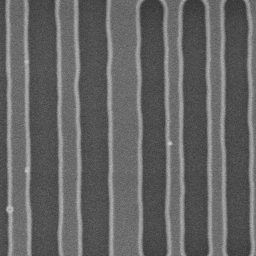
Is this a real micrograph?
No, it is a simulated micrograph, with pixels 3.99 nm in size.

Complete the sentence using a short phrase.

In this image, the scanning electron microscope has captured groups of lines, slits or small figures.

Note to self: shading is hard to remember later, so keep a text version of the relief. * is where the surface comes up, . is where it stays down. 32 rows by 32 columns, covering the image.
.**....***...****...***...**...*
.**....***...****....**...**...*
.**....***...****....**...**...*
.**....***...****....**...**...*
.**....***....***....**...**...*
.**....***....***....**...**...*
.**....***....***....**...**...*
.**....***....***....**...**...*
.**....***....***....**...**...*
.**....***....***....**...**...*
.**....***....***....**...**...*
.**....***....***....**...**...*
.**....***....***....**...**...*
.**....***....***....**...**...*
.**....***....****...**...**...*
.**....***....****...**...**...*
.**....***....****...**...**...*
.**....***....****...**...**...*
.**....***....***....**...**...*
.***...***....****...**...**...*
.***....**....****...**...**...*
.***...***....****...**...**...*
.***....**....****...**...**...*
.**.....**....****...**...**...*
.**.....**....****...**...**...*
.***....**....****...**...**...*
.***....**....****...**...**...*
.***....**....****...**...**...*
.***...***....****...**...**...*
.***...***....****...**...**...*
.***...***....****...**...**...*
.***...***....****...**...**...*